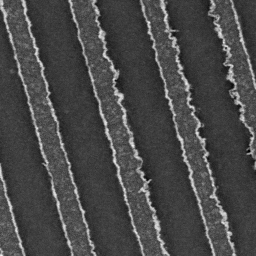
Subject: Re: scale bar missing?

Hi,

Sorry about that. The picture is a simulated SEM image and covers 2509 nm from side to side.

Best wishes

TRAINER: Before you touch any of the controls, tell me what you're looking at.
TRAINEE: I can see one or a few lines or trenches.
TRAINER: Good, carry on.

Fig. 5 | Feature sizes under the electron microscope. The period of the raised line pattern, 661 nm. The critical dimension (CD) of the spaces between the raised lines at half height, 442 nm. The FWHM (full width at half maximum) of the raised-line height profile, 209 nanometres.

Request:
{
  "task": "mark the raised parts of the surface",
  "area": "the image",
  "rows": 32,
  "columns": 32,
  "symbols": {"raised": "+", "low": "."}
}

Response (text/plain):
+++......+++......++......+++...
+++......+++......+++.....+++...
.++......+++......+++......+++..
.+++......+++......++......+++..
.+++......+++......++.......++..
.+++......+++......+++......++..
..+++.....+++......+++......+++.
..+++......+++......++......+++.
..+++......+++......+++......++.
...++......++++.....+++......+++
...+++......++.......++......+++
...+++......+++......+++.....+++
....++......+++......+++......++
....+++.....+++......+++......++
....+++......+++......++......++
....+++......+++......+++......+
.....++......+++......+++......+
.....+++......+++......++......+
.....+++......+++......+++.....+
.....+++......+++......+++......
......+++.....++++.....+++......
......+++......+++......++......
......+++......+++......+++.....
+......+++.....+++......+++.....
+......+++......+++......++.....
+......+++......+++......++.....
+......+++......+++......+++....
++......+++.....+++......+++....
++......+++......+++......+++...
++......+++......+++......+++...
+++......++.......++......+++...
+++......+++......+++......++...